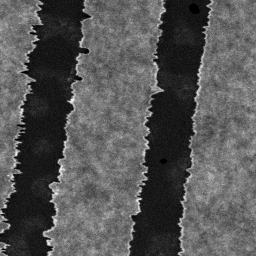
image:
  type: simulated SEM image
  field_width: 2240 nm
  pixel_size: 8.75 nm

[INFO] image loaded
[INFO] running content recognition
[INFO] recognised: one or a few lines or trenches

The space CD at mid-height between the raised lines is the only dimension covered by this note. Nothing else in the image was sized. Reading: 46.2 pixels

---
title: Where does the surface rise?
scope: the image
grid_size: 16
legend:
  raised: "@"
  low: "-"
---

@@---@@@@@---@@@
@@---@@@@@---@@@
@@---@@@@@---@@@
@@---@@@@@---@@@
@@---@@@@@--@@@@
@@---@@@@@--@@@@
@----@@@@---@@@@
@---@@@@@---@@@@
@---@@@@@---@@@@
@---@@@@@---@@@@
@---@@@@@---@@@@
@--@@@@@@---@@@@
---@@@@@@---@@@@
---@@@@@---@@@@@
---@@@@@---@@@@@
---@@@@@---@@@@@